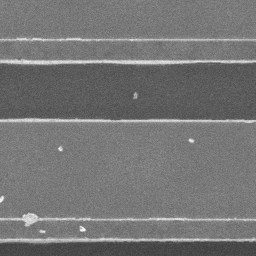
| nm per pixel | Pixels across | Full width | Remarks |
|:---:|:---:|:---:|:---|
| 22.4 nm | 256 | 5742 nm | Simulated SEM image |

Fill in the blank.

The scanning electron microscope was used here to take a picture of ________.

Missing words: lines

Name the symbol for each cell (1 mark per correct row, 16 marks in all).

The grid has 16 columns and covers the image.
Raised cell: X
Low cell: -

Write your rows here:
XXXXXXXXXXXXXXXX
XXXXXXXXXXXXXXXX
XXXXXXXXXXXXXXXX
XXXXXXXXXXXXXXXX
----------------
----------------
----------------
----------------
XXXXXXXXXXXXXXXX
XXXXXXXXXXXXXXXX
XXXXXXXXXXXXXXXX
XXXXXXXXXXXXXXXX
XXXXXXXXXXXXXXXX
XXXXXXXXXXXXXXXX
XXXXXXXXXXXXXXXX
----------------